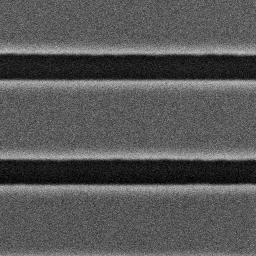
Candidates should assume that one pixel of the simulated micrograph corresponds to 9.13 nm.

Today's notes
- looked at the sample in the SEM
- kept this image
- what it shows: lines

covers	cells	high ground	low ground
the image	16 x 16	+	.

++++++++++++++++
++++++++++++++++
++++++++++++++++
................
................
++++++++++++++++
++++++++++++++++
++++++++++++++++
++++++++++++++++
++++++++++++++++
................
................
++++++++++++++++
++++++++++++++++
++++++++++++++++
++++++++++++++++